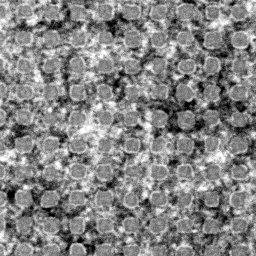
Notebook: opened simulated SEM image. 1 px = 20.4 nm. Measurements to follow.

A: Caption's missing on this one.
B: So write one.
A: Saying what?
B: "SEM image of a regular array of raised bodies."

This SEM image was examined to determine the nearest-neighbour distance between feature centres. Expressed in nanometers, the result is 531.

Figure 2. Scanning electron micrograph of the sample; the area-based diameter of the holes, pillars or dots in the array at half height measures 331 nanometers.